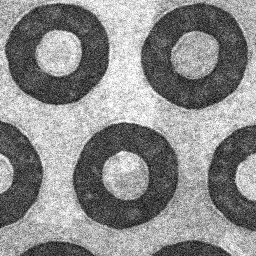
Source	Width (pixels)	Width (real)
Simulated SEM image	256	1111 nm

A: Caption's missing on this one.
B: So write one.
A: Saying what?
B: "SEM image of ring-shaped grooves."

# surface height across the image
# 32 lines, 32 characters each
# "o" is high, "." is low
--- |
oooooo...oooooooooooooo...oooooo
ooo.........ooooooooo........ooo
oo..........oooooooo..........oo
oo...........oooooo...........oo
o.....ooo.....oooo.....ooo.....o
o....ooooo....oooo....ooooo....o
o...oooooo....oooo...oooooo....o
o....ooooo....oooo...oooooo....o
o....ooooo....oooo....ooooo....o
o............ooooo.....ooo.....o
oo..........ooooooo...........oo
ooo........oooooooo..........ooo
ooooo.....ooooooooooo.......oooo
ooooooooooooooooooooooo...oooooo
oooooooooooooooooooooooooooooooo
.ooooooooooooo...ooooooooooooooo
...ooooooooo........ooooooooo...
....ooooooo..........ooooooo....
....oooooo............ooooo.....
.....ooooo....ooo.....ooooo....o
o....oooo....ooooo....oooo....oo
oo....ooo....ooooo....oooo....oo
oo...oooo....oooooo...oooo....oo
o....oooo....ooooo....oooo....oo
.....oooo.....oooo....oooo.....o
....oooooo...........oooooo.....
....oooooo..........ooooooo.....
...oooooooo........ooooooooo....
ooooooooooooo...oooooooooooooo..
oooooooooooooooooooooooooooooooo
ooooo.....ooooooooooo......ooooo
ooo........oooooooo..........ooo